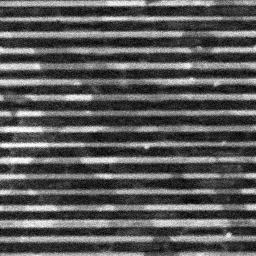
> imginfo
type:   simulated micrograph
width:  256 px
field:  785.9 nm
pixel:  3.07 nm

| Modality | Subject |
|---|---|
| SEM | parallel lines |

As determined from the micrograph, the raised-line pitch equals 48.4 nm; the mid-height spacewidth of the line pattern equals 35.7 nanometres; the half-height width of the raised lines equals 11.9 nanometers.